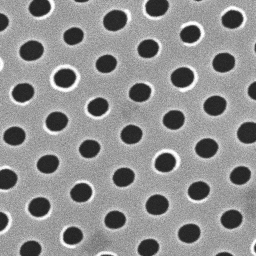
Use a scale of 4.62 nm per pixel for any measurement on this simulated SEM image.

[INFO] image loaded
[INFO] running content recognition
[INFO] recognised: a regular array of holes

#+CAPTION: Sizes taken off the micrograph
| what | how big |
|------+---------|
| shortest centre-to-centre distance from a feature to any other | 199 nm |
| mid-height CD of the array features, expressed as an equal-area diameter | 20.6 pixels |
